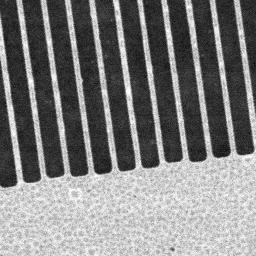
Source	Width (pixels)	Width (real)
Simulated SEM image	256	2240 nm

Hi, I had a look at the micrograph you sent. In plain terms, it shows parallel lines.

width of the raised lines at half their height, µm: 0.0325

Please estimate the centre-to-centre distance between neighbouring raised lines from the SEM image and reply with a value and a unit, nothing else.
209 nanometers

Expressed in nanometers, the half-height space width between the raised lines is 178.